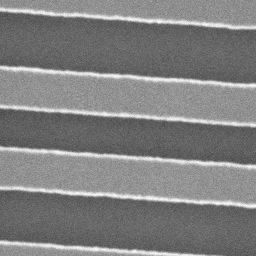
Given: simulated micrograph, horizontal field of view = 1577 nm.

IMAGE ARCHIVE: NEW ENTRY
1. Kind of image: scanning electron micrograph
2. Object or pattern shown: lines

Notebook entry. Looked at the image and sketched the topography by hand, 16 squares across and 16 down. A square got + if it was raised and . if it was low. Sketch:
++++++++++++++++
............++++
................
................
++++............
++++++++++++++++
++++++++++++++++
..........++++++
................
++++............
++++++++++++++++
++++++++++++++++
..........++++++
................
................
++++++..........